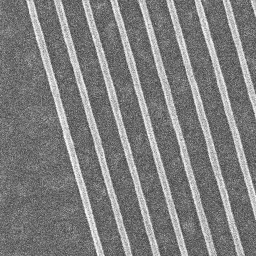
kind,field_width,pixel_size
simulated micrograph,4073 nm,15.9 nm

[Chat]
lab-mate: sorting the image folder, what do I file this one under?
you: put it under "parallel lines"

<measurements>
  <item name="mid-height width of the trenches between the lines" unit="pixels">21.3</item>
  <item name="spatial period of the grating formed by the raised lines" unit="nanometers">429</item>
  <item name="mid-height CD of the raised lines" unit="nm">88.1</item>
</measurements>